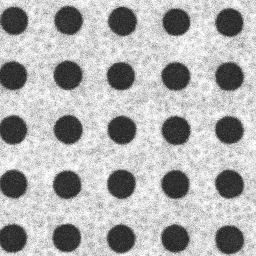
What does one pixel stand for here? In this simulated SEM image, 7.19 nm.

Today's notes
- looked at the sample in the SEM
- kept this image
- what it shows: a regular array of holes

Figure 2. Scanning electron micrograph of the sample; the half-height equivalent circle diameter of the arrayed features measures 203 nm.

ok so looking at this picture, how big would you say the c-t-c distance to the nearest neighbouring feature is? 385 nanometres